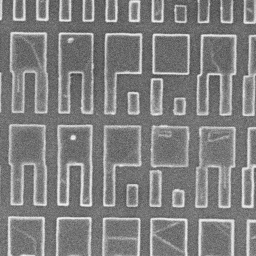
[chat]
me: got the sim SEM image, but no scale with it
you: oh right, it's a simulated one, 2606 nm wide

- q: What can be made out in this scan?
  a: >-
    wiring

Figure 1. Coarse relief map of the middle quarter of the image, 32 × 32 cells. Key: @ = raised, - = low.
@@@@@@@---@@@@@@@@@---@@@@@@@@@-
@@@@@@@---@@@@@@@@@---@@@@@@@@@-
@@---@@---@@@-------------------
@----@@---@@@-------------------
@----@@---@@@---------@@--------
@----@@---@@@---------@@--------
@----@@---@@@---------@@--------
@----@@----@@---@@----@@--------
@----@@----@@---@@----@@--------
@----@@----@@---@@----@@----@@--
@----@@----@@---@@----@@----@@--
@----@@----@@---@@----@@----@@--
--------------------------------
--------------------------------
--------------------------------
--------------------------------
@@@@@@@---@@@@@@@@@----@@@@@@@@-
@@@@@@@---@@@@@@@@@----@@@@@@@@-
@@@@@@@---@@@@@@@@@----@@@@@@@@-
@@@@@@@---@@@@@@@@@---@@@@@@@@@-
@@@@@@@---@@@@@@@@@---@@@@@@@@--
@@@@@@@---@@@@@@@@@---@@@@@@@@--
@@@@@@@---@@@@@@@@@---@@@@@@@@--
@@@@@@@---@@@@@@@@@---@@@@@@@@--
@@@@@@@---@@@@@@@@@---@@@@@@@@--
@----@@---@@@-------------------
@----@@---@@@-------------------
@----@@---@@@---------@@--------
@----@@---@@@---------@@--------
@----@@---@@@---------@@--------
@----@@---@@@---@@----@@--------
@----@----@@@---@@----@@--------